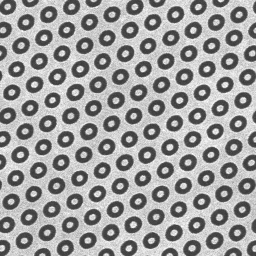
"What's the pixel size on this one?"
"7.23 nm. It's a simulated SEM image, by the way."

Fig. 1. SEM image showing a regular array of ring-shaped grooves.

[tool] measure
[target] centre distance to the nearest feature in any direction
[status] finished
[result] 0.171 micrometres